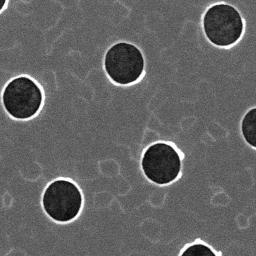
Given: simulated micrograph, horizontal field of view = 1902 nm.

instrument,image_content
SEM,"holes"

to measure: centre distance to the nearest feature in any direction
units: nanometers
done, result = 787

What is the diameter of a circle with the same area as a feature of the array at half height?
294 nanometres